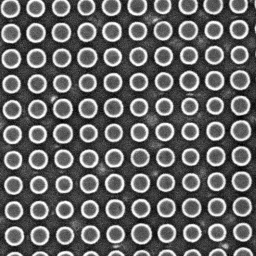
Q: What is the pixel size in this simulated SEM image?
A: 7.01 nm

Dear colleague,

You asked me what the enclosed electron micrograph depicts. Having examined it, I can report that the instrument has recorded a regular array of raised bodies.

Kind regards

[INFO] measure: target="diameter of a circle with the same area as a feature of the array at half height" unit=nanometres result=121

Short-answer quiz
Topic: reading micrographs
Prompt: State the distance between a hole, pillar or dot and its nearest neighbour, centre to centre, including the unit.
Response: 176 nm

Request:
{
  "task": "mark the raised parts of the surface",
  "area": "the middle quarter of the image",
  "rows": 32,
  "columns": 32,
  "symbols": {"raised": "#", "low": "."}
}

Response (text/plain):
.....##.........................
................................
........................##....##
#...###...####...###...####..###
#...####..####...####..####..###
#...####..####...####..####...##
#....##....##...................
................................
................................
#....##....###...###...####...##
##..####..#####..####..####...##
##..####..#####..####..####...##
##..####...###....##.....#......
................................
................................
#..........###....##....###...##
##..####...###...####..####...##
##..####...###...####..####...##
##..####...###...###....###...##
#...............................
................................
..................#.....##......
##...###...###...####..####...##
##..####..####...####..####...##
##..####...###...####...###...##
#.....#.....#.....#.............
................................
................................
#....###...###....###...###...##
##..####...####..####...###...##
##..####...####..####...###...##
#....###...###....##.....#.....#